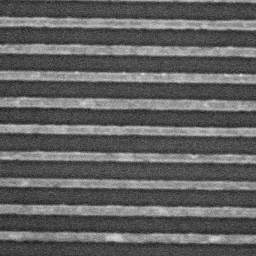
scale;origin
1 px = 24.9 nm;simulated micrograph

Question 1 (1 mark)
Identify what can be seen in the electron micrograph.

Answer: parallel lines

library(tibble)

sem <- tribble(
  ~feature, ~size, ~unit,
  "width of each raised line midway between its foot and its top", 171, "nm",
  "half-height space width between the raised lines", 488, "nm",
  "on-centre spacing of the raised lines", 26.8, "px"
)